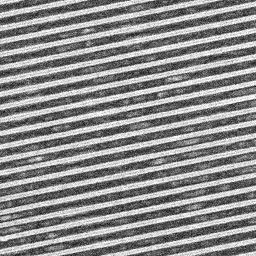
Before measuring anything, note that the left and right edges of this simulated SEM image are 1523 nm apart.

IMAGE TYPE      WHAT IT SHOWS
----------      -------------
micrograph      parallel lines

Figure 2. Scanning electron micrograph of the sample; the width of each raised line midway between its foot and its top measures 3.56 pixels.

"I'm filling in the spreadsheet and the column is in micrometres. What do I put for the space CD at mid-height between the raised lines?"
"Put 0.0519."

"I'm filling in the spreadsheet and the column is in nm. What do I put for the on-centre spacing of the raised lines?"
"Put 76.8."